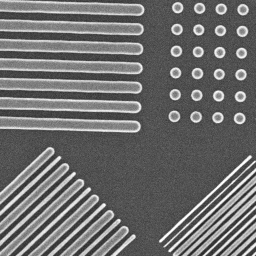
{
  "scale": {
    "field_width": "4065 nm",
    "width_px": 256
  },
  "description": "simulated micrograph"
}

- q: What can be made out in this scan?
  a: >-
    groups of lines, slits or small figures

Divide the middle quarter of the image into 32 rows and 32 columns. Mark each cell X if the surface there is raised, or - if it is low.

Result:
XXXXXXXXXXXXXXXXXXX-------------
XXXXXXXXXXXXXXXXXXX--------XX---
---------------------------XX---
--------------------------------
XXXXXXXXXXXXXXXX----------------
XXXXXXXXXXXXXXXXXXX-------------
XXXXXXXXXXXXXXXXXXX--------X----
---------------------------XX---
---------------------------XX---
XXXXXXXXXXXXXXXXXX--------------
XXXXXXXXXXXXXXXXXXX-------------
-XXXXXXXXXXXXXXXXXX-------------
--------------------------XXX---
--------------------------XXX---
XXXXXXXXXXXXXXXXXX--------------
XXXXXXXXXXXXXXXXXXX-------------
----XXXXXXXXXXXXXXX-------------
--------------------------------
--------------------------------
--------------------------------
--------------------------------
--------------------------------
--------------------------------
--------------------------------
--------------------------------
X-------------------------------
X-------------------------------
--X-----------------------------
-X------------------------------
X--XX---------------------------
--XXX---------------------------
-XXX-X--------------------------